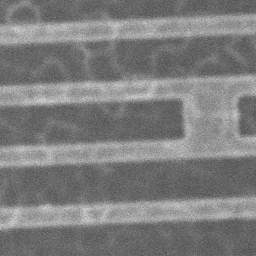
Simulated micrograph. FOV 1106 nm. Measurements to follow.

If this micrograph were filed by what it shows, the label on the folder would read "parallel lines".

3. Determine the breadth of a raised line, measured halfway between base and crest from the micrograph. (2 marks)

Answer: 0.0724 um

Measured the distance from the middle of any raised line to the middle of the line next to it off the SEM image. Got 264 nanometers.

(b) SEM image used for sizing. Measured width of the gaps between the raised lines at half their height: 190 nm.